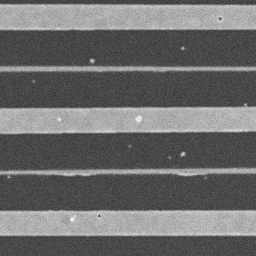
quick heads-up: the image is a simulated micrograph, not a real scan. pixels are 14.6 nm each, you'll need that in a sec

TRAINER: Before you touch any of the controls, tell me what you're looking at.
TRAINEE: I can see lines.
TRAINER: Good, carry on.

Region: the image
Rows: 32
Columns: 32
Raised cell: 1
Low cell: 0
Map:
00000000000000000000000000000000
11111111111111111111111111111111
11111111111111111111111111111111
11111111111111111111111111111111
00000000000000000000000000000000
00000000000000000000000000000000
00000000000000000000000000000000
00000000000000000000000000000000
00000000000000000000000000000000
00000000000000000000000000000000
00000000000000000000000000000000
00000000000000000000000000000000
00000000000000000000000000000000
00000000000000000000000000000011
11111111111111111111111111111111
11111111111111111111111111111111
11111111000000000000000000000000
00000000000000000000000000000000
00000000000000000000000000000000
00000000000000000000000000000000
00000000000000000000000000000000
00000000001100000000111110000000
00000000000000000000000000000000
00000000000000000000000000000000
00000000000000000000000000000000
00000000000000000000000000000000
00000011000001000011011110111111
11111111111111111111111111111111
11111111111111111111111111111111
00000000000000000000000000000000
00000000000000000000000000000000
00000000000000000000000000000000